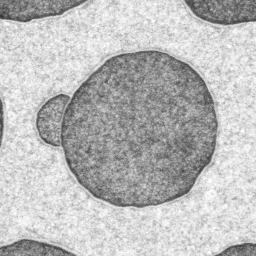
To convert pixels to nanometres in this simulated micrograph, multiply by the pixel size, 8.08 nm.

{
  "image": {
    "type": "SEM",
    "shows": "holes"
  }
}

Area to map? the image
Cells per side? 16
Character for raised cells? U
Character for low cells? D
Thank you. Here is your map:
DDDDDUUUUUUUDDDD
UUUUUUUUUUUUUDDU
UUUUUUUUUUUUUUUU
UUUUUUUDDDDUUUUU
UUUUUUDDDDDDUUUU
UUUUUDDDDDDDDUUU
UUUDDDDDDDDDDUUU
UUDDDDDDDDDDDDUU
UUUDDDDDDDDDDDUU
UUUUDDDDDDDDDUUU
UUUUDDDDDDDDDUUU
UUUUUDDDDDDDUUUU
UUUUUUDDDDDUUUUU
UUUUUUUUUUUUUUUU
UUUUUUUUUUUUUUUU
DDDDUUUUUUUUUUDD